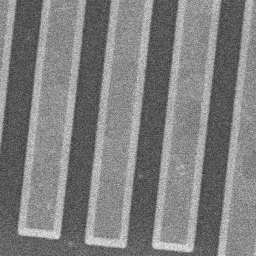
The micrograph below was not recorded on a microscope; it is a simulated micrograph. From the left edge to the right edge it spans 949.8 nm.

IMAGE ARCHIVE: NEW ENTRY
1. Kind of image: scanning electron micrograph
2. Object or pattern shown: one or a few lines or trenches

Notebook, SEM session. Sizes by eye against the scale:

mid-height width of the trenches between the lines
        0.122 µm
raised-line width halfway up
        0.126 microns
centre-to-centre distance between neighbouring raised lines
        249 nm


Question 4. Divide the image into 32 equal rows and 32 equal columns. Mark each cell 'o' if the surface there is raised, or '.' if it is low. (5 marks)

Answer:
o.....oooo....ooooo....oooo....o
o.....oooo....oooo.....oooo....o
o.....oooo....oooo.....oooo....o
o.....oooo....oooo....ooooo....o
o....ooooo....oooo....ooooo....o
o....ooooo....oooo....oooo.....o
o....ooooo....oooo....oooo.....o
o....oooo.....oooo....oooo....oo
o....oooo....ooooo....oooo....oo
.....oooo....ooooo....oooo....oo
.....oooo....oooo.....oooo....oo
.....oooo....oooo.....oooo....oo
.....oooo....oooo....ooooo....oo
....ooooo....oooo....ooooo....oo
....ooooo....oooo....oooo.....oo
....ooooo....oooo....oooo.....oo
....oooo.....oooo....oooo....ooo
....oooo....ooooo....oooo....ooo
....oooo....ooooo....oooo....ooo
....oooo....oooo.....oooo....ooo
....oooo....oooo.....oooo....ooo
....oooo....oooo.....oooo....ooo
...ooooo....oooo....ooooo....ooo
...ooooo....oooo....oooo.....ooo
...ooooo....oooo....oooo.....ooo
...oooo.....oooo....oooo....oooo
...oooo....ooooo....oooo....oooo
...oooo....ooooo....oooo....oooo
...oooo....oooo.....oooo....oooo
...........oooo.....oooo....oooo
....................oooo....oooo
............................oooo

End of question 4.